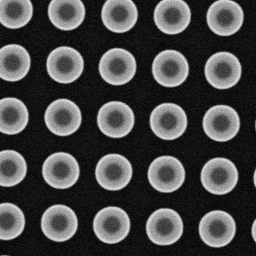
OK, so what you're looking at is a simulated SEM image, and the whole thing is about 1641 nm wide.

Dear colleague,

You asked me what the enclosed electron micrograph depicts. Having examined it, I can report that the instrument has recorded an array of small figures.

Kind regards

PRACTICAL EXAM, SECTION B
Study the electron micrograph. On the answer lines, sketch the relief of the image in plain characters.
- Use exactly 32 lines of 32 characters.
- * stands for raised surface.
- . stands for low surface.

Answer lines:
****..****...****...***....***..
****..*****..****..*****..****..
****..****...****..*****..****..
.*.....**....***....***...****..
................................
................................
***....***...***....**..........
****..****...****..****...****..
****..****..*****..****...****..
***...****...****..****...****..
..............*.....**....***...
................................
**.....*........................
***...****...***....***...***...
***...****..*****..****...****..
***...****..*****..****..*****..
**.....**....***...****...****..
...........................*....
................................
***...***....**.................
***..*****..****...****...***...
***..*****..****...****..*****..
***...****..****...****..*****..
.......*.....**....***....***...
................................
*...............................
***...***...****...***....**....
***..*****..****...****..****...
***..*****..****..*****..****...
**....***...****...****..****...
....................*.....**....
................................